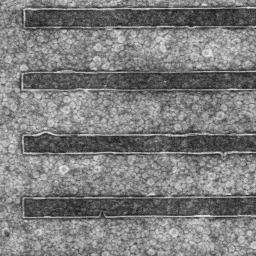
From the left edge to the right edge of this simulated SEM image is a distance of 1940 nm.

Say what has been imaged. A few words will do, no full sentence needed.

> one or a few lines or trenches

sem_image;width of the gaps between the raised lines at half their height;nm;335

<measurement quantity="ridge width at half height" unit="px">19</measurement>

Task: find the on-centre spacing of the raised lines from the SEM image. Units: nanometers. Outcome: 478